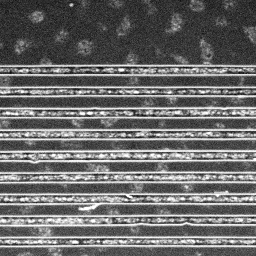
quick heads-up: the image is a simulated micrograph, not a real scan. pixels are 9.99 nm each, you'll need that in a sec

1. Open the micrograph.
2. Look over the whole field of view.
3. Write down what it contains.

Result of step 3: parallel lines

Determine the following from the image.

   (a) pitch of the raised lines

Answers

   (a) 0.214 micrometres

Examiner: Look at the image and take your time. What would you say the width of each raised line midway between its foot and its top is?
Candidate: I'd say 131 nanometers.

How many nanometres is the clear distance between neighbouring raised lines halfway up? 83.7